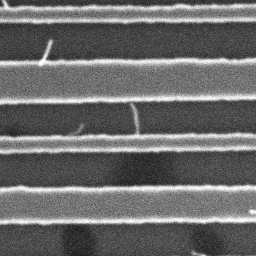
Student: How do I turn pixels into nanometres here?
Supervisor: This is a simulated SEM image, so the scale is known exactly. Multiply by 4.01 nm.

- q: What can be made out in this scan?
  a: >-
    lines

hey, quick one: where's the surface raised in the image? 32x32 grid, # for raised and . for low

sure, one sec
................................
################################
################################
................................
................................
................................
................................
......................###..#...#
################################
################################
################################
################################
##################..............
................................
................................
................................
................................
################################
################################
................................
................................
................................
................................
.###....###..###################
################################
################################
################################
################################
................................
................................
................................
................................